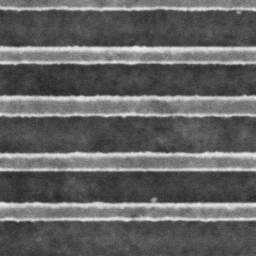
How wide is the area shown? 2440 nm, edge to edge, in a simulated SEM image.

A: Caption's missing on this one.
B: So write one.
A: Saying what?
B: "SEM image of lines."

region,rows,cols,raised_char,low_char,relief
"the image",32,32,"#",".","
################################
................................
................................
................................
................................
................................
################################
################################
................................
................................
................................
................................
################################
################################
#########....#.#..###..###.##..#
................................
................................
................................
................................
################################
################################
................................
................................
................................
................................
######.#######.#################
################################
..#................#.....#......
................................
................................
................................
................................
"